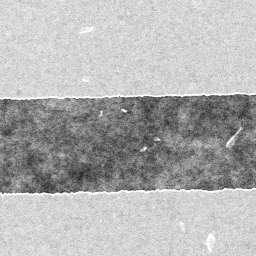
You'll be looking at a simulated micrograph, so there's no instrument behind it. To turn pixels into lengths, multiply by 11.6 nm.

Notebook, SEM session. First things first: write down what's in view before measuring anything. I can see one or a few lines or trenches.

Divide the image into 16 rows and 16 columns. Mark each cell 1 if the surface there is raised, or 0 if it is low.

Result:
1111111111111111
1111111111111111
1111111111111111
1111111111111111
1111111111111111
1111111111111111
0000000000000000
0000000000000000
0000000000000000
0000000000000000
0000000000000000
0000000000000000
1111111111111111
1111111111111111
1111111111111111
1111111111111111